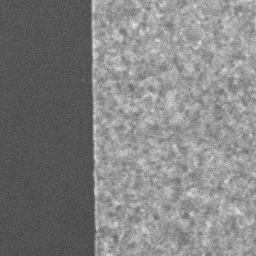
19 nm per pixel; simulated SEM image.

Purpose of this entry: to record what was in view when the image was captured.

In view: wiring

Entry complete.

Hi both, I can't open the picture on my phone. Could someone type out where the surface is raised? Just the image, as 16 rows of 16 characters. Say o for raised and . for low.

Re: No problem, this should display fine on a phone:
......oooooooooo
......oooooooooo
......oooooooooo
......oooooooooo
......oooooooooo
......oooooooooo
......oooooooooo
......oooooooooo
......oooooooooo
......oooooooooo
......oooooooooo
......oooooooooo
......oooooooooo
......oooooooooo
......oooooooooo
......oooooooooo